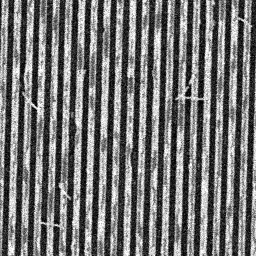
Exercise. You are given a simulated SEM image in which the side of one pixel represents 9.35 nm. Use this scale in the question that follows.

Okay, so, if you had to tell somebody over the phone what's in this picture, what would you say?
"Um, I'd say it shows parallel lines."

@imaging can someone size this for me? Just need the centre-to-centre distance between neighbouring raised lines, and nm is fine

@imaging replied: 120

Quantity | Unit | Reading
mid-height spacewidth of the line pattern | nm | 65.4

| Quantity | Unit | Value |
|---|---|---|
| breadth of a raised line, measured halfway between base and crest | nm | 57.2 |